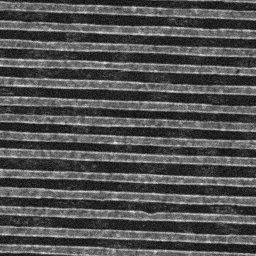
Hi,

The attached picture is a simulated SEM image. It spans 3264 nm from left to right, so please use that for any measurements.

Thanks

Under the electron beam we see parallel lines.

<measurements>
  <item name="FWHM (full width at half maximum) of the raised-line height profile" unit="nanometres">94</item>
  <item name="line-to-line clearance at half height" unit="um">0.142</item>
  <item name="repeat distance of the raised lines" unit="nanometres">238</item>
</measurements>